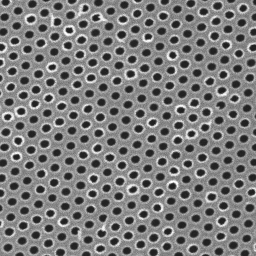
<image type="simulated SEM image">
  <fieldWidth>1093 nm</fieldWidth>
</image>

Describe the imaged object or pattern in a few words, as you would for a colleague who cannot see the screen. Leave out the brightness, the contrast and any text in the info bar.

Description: a regular array of holes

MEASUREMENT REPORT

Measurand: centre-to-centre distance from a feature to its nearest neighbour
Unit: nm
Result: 62.8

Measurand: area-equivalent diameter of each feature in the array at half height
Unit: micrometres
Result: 0.034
